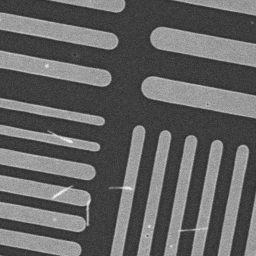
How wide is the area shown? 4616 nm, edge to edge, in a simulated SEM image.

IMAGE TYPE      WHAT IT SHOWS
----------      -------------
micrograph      groups of lines, slits or small figures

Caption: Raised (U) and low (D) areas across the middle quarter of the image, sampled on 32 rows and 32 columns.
UUUUDDDDDDDDDDDDDDDDDDDDDDDDDDDD
UUUUUUUUUUDDDDDDDDDDDDDDDDDDDDDD
UUUUUUUUUUUDDDDDDDDDDDDDDDDDDDDD
UUUUUUUUUUUUDDDDDDDDDUUUDDDDDDDD
DDDDUUUUUUUDDDDDDDDDUUUUUUUUUDDD
DDDDDDDDDDDDDDDDDDDDUUUUUUUUUUUU
DDDDDDDDDDDDDDDDDDDDUUUUUUUUUUUU
DDDDDDDDDDDDDDDDDDDDUUUUUUUUUUUU
DDDDDDDDDDDDDDDDDDDDDUUUUUUUUUUU
DDDDDDDDDDDDDDDDDDDDDDDDDDUUUUUU
DDDDDDDDDDDDDDDDDDDDDDDDDDDDDDDD
DDDDDDDDDDDDDDDDDDDDDDDDDDDDDDDD
UUUUUDDDDDDDDDDDDDDDDDDDDDDDDDDD
UUUUUUUUUDDDDDDDDDDDDDDDDDDDDDDD
DDDDDUUUUUDDDDDDDDDDDDDDDDDDDDDD
DDDDDDDDDDDDDDDDDDUDDDDDDDDDDDDD
DDDDDDDDDDDDDDDDDUUUDDDDDDDDDDDD
DDDDDDDDDDDDDDDDDUUUDDDDUUUDDDDD
UDDDDDDDDDDDDDDDDUUUDDDDUUUDDDDU
UUUUUUDDDDDDDDDDDUUUDDDDUUUDDDUU
DUUUUUUUUDDDDDDDDUUUDDDDUUDDDDUU
DDDDDDUUDDDDDDDDDUUDDDDUUUDDDDUU
DDDDDDDDDDDDDDDDUUUDDDDUUUDDDDUU
DDDDDDDDDDDDDDDDUUUDDDDUUUDDDDUU
UUDDDDDDDDDDDDDDUUUDDDDUUUDDDUUU
UUUUUUUDDDDDDDDDUUUDDDDUUDDDDUUU
UUUUUUUUDDDDDDDDUUDDDDUUUDDDDUUU
UUUUUUUUDDDDDDDUUUDDDDUUUDDDDUUU
DDDUUUUDDDDDDDDUUUDDDDUUUDDDDUUD
DDDDDDDDDDDDDDDUUUDDDDUUUDDDUUUD
DDDDDDDDDDDDDDDUUUDDDDUUDDDDUUUD
UUUUDDDDDDDDDDDUUUDDDUUUDDDDUUUD